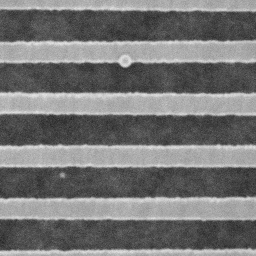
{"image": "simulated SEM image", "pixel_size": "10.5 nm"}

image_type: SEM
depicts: lines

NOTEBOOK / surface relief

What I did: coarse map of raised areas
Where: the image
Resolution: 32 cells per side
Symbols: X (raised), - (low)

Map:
XXXXXXXXXXXXXXXXXXXXXXXXXXXXXXXX
--------------------------------
--------------------------------
--------------------------------
--------------------------------
XXXXXXXXXXXXXXXXXXXXXXXXXXXXXXXX
XXXXXXXXXXXXXXXXXXXXXXXXXXXXXXXX
XXXXXXXXXXXXXXXXXXXXXXXXXXXXXXXX
--------------------------------
--------------------------------
--------------------------------
--------------------------------
XXXXXXXXXXXXXXXXXXXXXXXXXXXXXXXX
XXXXXXXXXXXXXXXXXXXXXXXXXXXXXXXX
--------------------------------
--------------------------------
--------------------------------
--------------------------------
XXXXXXXXXXXXXXXXXXXXXXXXXXXXXXXX
XXXXXXXXXXXXXXXXXXXXXXXXXXXXXXXX
XXXXXXXXXXXXXXXXXXXXXXXXXXXXXXXX
--------------------------------
--------------------------------
--------------------------------
--------------------------------
XXXXXXXXXXXXXXXXXXXXXXXXXXXXXXXX
XXXXXXXXXXXXXXXXXXXXXXXXXXXXXXXX
-------------------------X----X-
--------------------------------
--------------------------------
--------------------------------
XXXXXXXXXXXXXXXXXXXXXXXXXXXXXXXX